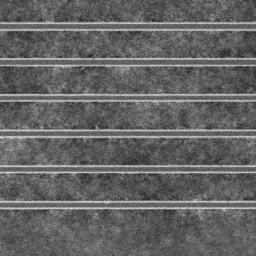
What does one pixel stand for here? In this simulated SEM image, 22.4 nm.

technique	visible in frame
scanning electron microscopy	parallel lines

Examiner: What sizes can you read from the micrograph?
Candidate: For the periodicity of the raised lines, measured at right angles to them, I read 801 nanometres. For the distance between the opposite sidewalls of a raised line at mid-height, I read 154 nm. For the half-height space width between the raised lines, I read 640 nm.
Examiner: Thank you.